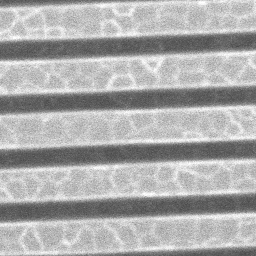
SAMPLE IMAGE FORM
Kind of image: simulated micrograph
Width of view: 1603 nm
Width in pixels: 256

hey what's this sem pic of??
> parallel lines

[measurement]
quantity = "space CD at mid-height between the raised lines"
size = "113 nm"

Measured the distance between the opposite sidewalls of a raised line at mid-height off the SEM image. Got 0.221 µm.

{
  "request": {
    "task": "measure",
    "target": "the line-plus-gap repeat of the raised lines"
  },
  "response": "337 nanometers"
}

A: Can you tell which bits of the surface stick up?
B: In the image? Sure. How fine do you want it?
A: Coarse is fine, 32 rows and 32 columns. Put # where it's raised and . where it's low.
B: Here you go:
........########################
################################
################################
################################
##################..............
................................
...........................#####
..##.###########################
################################
################################
################################
#############...................
................................
......................##########
################################
################################
################################
###############################.
#####...........................
................................
..............##################
################################
################################
################################
#######################.........
................................
................................
.......#########################
################################
################################
################################
#################...............